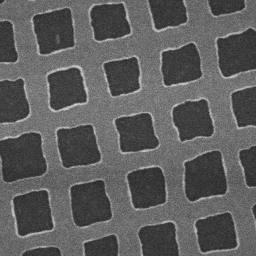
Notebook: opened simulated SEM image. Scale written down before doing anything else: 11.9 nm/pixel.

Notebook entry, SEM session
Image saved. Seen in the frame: a regular array of holes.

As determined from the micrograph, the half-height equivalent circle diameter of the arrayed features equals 497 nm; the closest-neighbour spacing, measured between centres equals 0.671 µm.